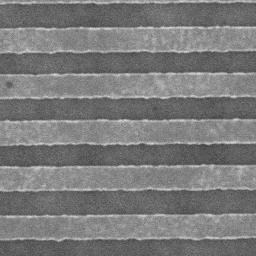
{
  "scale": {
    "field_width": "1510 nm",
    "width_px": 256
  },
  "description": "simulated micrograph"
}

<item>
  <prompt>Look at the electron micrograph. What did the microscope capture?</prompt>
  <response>lines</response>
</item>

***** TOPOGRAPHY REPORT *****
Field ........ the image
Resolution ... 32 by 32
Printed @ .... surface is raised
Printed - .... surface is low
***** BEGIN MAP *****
--------------------------------
--------------------------------
--------------------------------
----------@------@@@@@@@@@@@@@@@
@@@@@@@@@@@@@@@@@@@@@@@@@@@@@@@@
@@@@@@@@@@@@@@@@@@@@@@@@@@@@@@@@
@@@@@@@--@@-@@-----@--@@--------
--------------------------------
--------------------------------
@@@@@@@@@@@@@@@@@@@@@@@@@@@@@@@@
@@@@@@@@@@@@@@@@@@@@@@@@@@@@@@@@
@@@@@@@@@@@@@@@@@@@@@@@@@@@@@@@@
--------------------------------
--------------------------------
--------------------------------
@@@@@@@@@@@@@@@@@@@@@@@@@@@@@@@@
@@@@@@@@@@@@@@@@@@@@@@@@@@@@@@@@
@@@@@@@@@@@@@@@@@@@@@@@@@@@@@@@@
--------------------------------
--------------------------------
--------------------------------
@@@@@@@@@@@@@@@@@@@@@@@@@@@@@@@@
@@@@@@@@@@@@@@@@@@@@@@@@@@@@@@@@
@@@@@@@@@@@@@@@@@@@@@@@@@@@@@@@@
--------------------------------
--------------------------------
--------------------------------
@@@@@@@@@@@@@@@@@@@@@@@@@@@@@@@@
@@@@@@@@@@@@@@@@@@@@@@@@@@@@@@@@
@@@@@@@@@@@@@@@@@@@@@@@@@@@@@@@@
--------------------------------
--------------------------------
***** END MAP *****